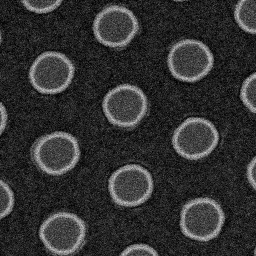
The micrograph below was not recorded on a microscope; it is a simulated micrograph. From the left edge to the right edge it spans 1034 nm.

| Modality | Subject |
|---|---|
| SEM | a regular array of raised bodies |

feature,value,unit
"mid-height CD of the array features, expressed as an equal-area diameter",0.164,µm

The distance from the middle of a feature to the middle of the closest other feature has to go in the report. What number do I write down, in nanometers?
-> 318